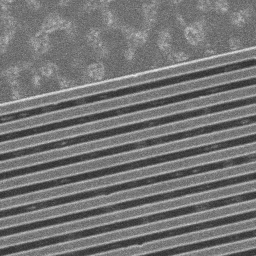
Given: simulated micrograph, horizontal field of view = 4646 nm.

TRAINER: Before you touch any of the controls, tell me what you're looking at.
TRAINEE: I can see parallel lines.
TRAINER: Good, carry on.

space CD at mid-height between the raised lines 146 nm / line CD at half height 195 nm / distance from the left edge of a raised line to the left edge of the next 336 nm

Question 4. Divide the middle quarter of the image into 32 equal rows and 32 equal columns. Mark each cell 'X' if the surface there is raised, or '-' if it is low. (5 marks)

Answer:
----------------------------XXXX
-----------------------XXXXXXXXX
-------------------XXXXXXXXXXX--
--------------XXXXXXXXXXX-------
----------XXXXXXXXXXX---------XX
-----XXXXXXXXXXX----------XXXXXX
XXXXXXXXXXXXX---------XXXXXXXXXX
XXXXXXXX---------XXXXXXXXXXXX---
XXX----------XXXXXXXXXXXX-------
--------XXXXXXXXXXXX----------XX
----XXXXXXXXXXXX---------XXXXXXX
XXXXXXXXXXX----------XXXXXXXXXXX
XXXXXXX---------XXXXXXXXXXX-----
XX----------XXXXXXXXXXX---------
--------XXXXXXXXXX----------XXXX
---XXXXXXXXXXX---------XXXXXXXXX
XXXXXXXXXX---------XXXXXXXXXXXX-
XXXXX----------XXXXXXXXXXXX-----
X---------XXXXXXXXXXXX----------
------XXXXXXXXXXXX---------XXXXX
-XXXXXXXXXXXX----------XXXXXXXXX
XXXXXXXXX---------XXXXXXXXXXXX--
XXXX----------XXXXXXXXXXX-------
---------XXXXXXXXXXX-----------X
-----XXXXXXXXXXX----------XXXXXX
-XXXXXXXXXXX----------XXXXXXXXXX
XXXXXXXX----------XXXXXXXXXX----
XXXX---------XXXXXXXXXXX--------
---------XXXXXXXXXXX---------XXX
----XXXXXXXXXXX----------XXXXXXX
XXXXXXXXXXX---------XXXXXXXXXXXX
XXXXXX----------XXXXXXXXXXXX----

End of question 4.